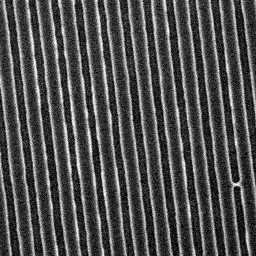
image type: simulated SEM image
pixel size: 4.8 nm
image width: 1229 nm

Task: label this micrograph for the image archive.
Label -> parallel lines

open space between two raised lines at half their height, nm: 38.7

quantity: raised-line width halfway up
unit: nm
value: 70.3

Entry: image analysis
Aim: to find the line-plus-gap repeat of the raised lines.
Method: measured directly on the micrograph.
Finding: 109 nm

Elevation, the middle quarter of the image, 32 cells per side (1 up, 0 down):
01110011110011110011100011100111
01110011110011110011110011100111
01111001110011110011110011100011
01111001110011110011110011100011
01111001111001110011110011110011
01111001111001110011110011110011
01111001111001110001110011110011
01111001111001110001110011110011
00111001111001111001110011110011
00111001111001111001110011110011
00111100111001111001111001110001
00111100111001111001111001110001
00111100111100111001111001111001
00111100111100111001111001111001
00111100111100111000111001111001
00111100111100111000111001111001
00011100111100111000111001111001
10011110111100111000111001111000
10011110111100111100111100111001
10011110011100111100111100111000
10011110011100111100111100111100
10011110011110111100111100111100
10011110011110011100111100111100
10011110011110011100011100111100
10011110011110011100011100111100
11011110011110011110011100011100
11001110011110011110011100011100
11001111011110011110011110011100
11001111011110011110011110011110
11001111001111001110011110011110
11001111001111001110011110011110
11001111001111001110001110011110